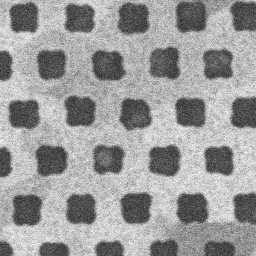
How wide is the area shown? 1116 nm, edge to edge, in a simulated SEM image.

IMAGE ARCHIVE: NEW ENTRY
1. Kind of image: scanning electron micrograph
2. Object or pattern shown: a regular array of holes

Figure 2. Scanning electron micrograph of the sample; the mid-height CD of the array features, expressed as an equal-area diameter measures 154 nanometers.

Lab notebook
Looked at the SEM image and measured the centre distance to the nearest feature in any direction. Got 0.234 um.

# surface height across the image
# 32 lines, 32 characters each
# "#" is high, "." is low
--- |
##...###...####...####....###...
#....###....###....###....###...
#....###....###....###....###...
#....###....###....###....###...
################################
################################
.####...####...####...###....###
..##.....##.....###...###....###
..###...###.....###...###....###
..###...###.....###...###....###
################################
################################
#....###....###...####....###...
#....###....###....###....###...
#....###....###....###....###...
#....###....###....###....###...
################################
################################
.####...####...####...####...###
..##.....##.....##.....##....###
..###....##.....##.....##....###
..###...####...####...###....###
################################
################################
##...###....###....###...####...
#....###....###....###....###...
#....###....###....###....###...
#....###....###....###....###...
################################
################################
..###...####....###...####...###
..###....###....###....##.....##